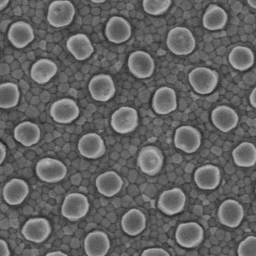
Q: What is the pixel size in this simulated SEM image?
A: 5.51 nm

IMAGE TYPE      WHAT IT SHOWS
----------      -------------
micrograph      a regular array of raised bodies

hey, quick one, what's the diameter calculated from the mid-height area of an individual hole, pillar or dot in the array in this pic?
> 141 nanometers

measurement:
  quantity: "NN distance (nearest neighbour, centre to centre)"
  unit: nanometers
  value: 232